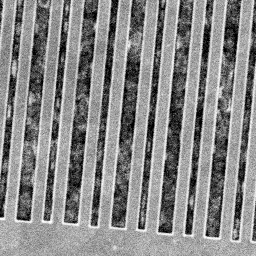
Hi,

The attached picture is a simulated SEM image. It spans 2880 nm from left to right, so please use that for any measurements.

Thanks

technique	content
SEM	parallel lines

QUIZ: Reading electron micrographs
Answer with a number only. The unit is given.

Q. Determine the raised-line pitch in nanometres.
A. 267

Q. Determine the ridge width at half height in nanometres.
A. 133